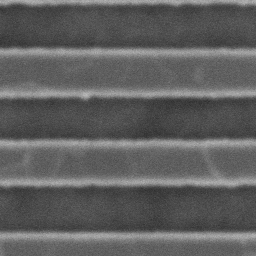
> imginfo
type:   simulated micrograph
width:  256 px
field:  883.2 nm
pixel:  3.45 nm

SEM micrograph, lines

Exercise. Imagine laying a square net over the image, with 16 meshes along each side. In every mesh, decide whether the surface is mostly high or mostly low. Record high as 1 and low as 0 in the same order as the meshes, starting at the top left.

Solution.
0000000000000000
0000000000000000
0000000000000000
1111111111111111
1111111111111111
1111111111111111
0000000000000000
0000000000000000
0000000000000000
1111111111111111
1111111111111111
1111111111111110
0000000000000000
0000000000000000
0000000000000000
1111111111111111